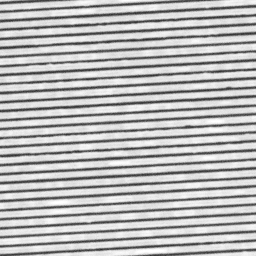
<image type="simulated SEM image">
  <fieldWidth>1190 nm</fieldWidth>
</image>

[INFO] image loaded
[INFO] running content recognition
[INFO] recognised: parallel lines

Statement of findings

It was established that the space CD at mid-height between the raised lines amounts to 15.7 nm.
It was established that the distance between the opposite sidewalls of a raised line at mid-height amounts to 27.8 nm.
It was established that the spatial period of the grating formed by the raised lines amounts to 41.9 nm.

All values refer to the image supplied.